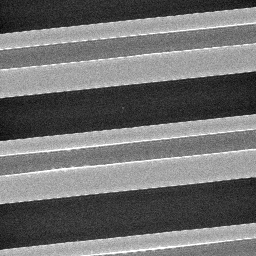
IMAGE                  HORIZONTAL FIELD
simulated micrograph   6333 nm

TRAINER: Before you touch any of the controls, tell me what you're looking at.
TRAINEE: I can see lines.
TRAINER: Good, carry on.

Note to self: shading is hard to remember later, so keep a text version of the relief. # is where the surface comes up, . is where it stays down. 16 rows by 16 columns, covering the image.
................
......##########
################
################
###############.
######..........
................
.............###
...#############
################
################
############....
##..............
................
...........#####
.###############